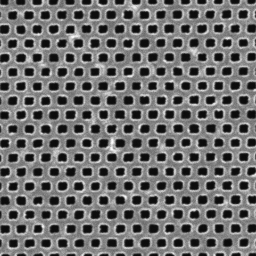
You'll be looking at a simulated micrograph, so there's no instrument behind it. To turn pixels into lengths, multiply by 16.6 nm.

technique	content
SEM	a regular array of holes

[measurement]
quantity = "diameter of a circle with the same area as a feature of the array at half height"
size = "164 nm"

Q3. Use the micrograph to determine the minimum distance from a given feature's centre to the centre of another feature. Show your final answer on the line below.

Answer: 268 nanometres